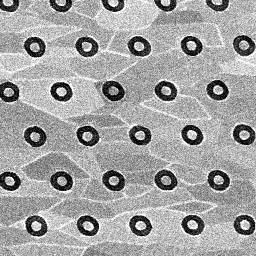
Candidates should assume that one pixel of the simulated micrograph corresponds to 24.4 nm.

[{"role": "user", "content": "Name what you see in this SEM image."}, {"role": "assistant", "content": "a regular array of ring-shaped grooves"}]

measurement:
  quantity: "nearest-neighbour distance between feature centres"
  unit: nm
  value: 1250